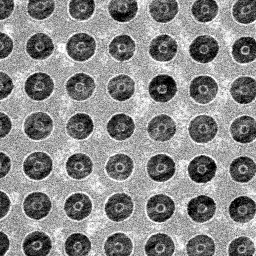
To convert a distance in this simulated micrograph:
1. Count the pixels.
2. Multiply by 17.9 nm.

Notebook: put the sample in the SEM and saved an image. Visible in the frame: a regular array of ring-shaped grooves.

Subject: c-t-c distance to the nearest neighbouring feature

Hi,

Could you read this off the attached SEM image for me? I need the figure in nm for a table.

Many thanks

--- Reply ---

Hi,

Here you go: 712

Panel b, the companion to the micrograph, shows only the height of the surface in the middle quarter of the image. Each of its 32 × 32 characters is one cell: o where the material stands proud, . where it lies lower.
oooooooooooooooooooooooooooooooo
oooooooooooooooooooooooooooooooo
ooo...oooooooo.ooooooooo..oooooo
o......ooooo.....ooooo.....ooooo
........ooo.......ooo.......oooo
...oo...ooo...o...ooo...o...ooo.
...o....ooo...o...ooo...o...ooo.
o......oooo.......ooo.......ooo.
oo....oooooo.....ooooo.....ooooo
ooooooooooooooooooooooo...oooooo
oooooooooooooooooooooooooooooooo
oooooooooooooooooooooooooooooooo
ooo...ooooooo...oooooooo.ooooooo
o......ooooo.....ooooo.....ooooo
o......oooo.......ooo.......ooo.
...oo...oo...oo...ooo...o...ooo.
.......oooo...o...ooo...o...ooo.
o......oooo......oooo.......ooo.
oo....oooooo....oooooo.....ooooo
oooooooooooooooooooooooooooooooo
oooooooooooooooooooooooooooooooo
oooooooooooooooooooooooooooooooo
oo...oooooooo...ooooooo...oooooo
o......oooo......oooo......ooooo
.......oooo......oooo.......ooo.
...oo..ooo...oo...oo...oo...ooo.
.......ooo...oo..oooo..oo...ooo.
o......oooo......oooo.......ooo.
oo...oooooo.....ooooo......oooo.
ooooooooooooooooooooooo..ooooooo
oooooooooooooooooooooooooooooooo
oooooooooooooooooooooooooooooooo